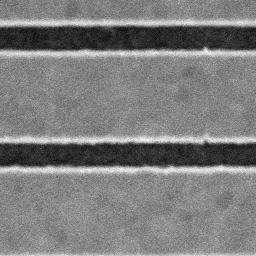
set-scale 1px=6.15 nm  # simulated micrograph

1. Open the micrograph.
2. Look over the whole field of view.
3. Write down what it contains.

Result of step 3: one or a few lines or trenches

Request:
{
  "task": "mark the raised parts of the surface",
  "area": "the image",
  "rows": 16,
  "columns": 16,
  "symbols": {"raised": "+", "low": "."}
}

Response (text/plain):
++++++++++++++++
................
................
++++++++++++++++
++++++++++++++++
++++++++++++++++
++++++++++++++++
++++++++++++++++
++++++++++++++++
................
................
++++++++++++++++
++++++++++++++++
++++++++++++++++
++++++++++++++++
++++++++++++++++